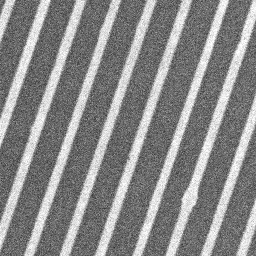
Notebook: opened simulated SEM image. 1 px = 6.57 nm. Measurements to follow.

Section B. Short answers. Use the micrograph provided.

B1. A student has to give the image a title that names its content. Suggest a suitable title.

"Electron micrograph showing parallel lines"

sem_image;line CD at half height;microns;0.0528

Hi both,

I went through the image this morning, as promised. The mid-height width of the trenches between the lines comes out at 0.165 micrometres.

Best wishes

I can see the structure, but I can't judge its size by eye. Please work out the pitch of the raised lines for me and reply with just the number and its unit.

0.22 microns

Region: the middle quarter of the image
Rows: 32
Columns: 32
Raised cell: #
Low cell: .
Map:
......###......##.......##......
......##.......##.......##......
......##.......##......###......
.....###......##.......##.......
.....##.......##.......##.......
.....##.......##......##........
....###......##.......##........
....##.......##.......##.......#
....##.......##......##........#
...###......##.......##.......##
...##.......##.......##.......##
...##.......##......##........##
..###......##.......##.......##.
..##.......##.......##.......##.
..##......###......##........##.
.##.......##.......##.......##..
.##.......##.......##.......##..
.##......###......##........##..
##.......##.......##.......##...
##.......##.......##.......##...
##......###......##........##...
#.......##.......##.......##....
#.......##.......##.......##....
#......###......##........##....
.......##.......##.......##.....
.......##.......##.......##.....
......###......##........##.....
......##.......##.......##......
......##......###.......##......
.....##.......##........##......
.....##.......##.......##.......
.....##......###.......##......#